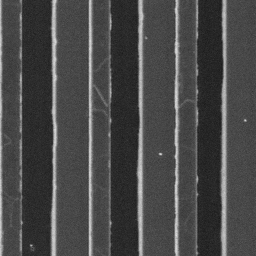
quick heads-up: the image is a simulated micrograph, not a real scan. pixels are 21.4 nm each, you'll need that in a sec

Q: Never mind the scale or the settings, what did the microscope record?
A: lines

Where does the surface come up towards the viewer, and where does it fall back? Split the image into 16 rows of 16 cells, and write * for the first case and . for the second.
*..****..***..**
*..****..***..**
*..****..***..**
*..****..***..**
*..****..***..**
*..****..***..**
*..****..***..**
*..****..***..**
*..****..***..**
*..****..***..**
*..****..***..**
*..****..***..**
*..****..***..**
*..****..***..**
*..****..***..**
*..****..***..**